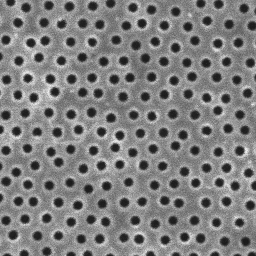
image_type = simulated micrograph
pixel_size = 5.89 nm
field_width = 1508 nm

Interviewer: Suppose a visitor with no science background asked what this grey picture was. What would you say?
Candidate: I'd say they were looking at a regular array of holes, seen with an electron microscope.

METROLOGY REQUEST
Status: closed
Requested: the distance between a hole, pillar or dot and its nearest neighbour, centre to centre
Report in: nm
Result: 104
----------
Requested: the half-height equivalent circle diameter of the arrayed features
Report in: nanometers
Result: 59.8